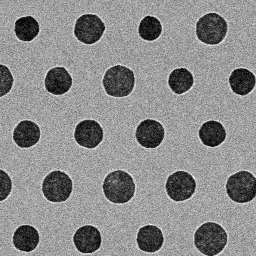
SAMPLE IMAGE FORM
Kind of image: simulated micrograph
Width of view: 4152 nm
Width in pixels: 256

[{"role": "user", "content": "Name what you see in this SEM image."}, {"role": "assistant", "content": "a regular array of holes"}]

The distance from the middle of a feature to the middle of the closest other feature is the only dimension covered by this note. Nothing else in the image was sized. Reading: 982 nm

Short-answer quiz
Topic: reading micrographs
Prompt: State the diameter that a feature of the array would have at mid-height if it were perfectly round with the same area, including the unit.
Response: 0.461 µm